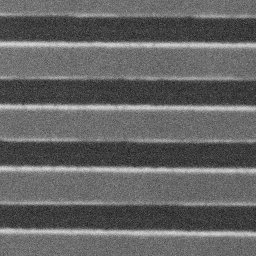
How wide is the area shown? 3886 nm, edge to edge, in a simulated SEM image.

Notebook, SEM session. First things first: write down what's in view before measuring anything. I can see lines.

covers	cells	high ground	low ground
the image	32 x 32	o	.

oooooooooooooooooooooooooooooooo
oooooooooooooooooooooooooooooooo
................................
................................
................................
................................
oooooooooooooooooooooooooooooooo
oooooooooooooooooooooooooooooooo
oooooooooooooooooooooooooooooooo
oooooooooooooooooooooooooooooooo
................................
................................
................................
oooooooooooooooooooo............
oooooooooooooooooooooooooooooooo
oooooooooooooooooooooooooooooooo
oooooooooooooooooooooooooooooooo
oooooooooooooooooooooooooooooooo
................................
................................
................................
oooooooooooooooooooooooooooooooo
oooooooooooooooooooooooooooooooo
oooooooooooooooooooooooooooooooo
oooooooooooooooooooooooooooooooo
.......................ooooooooo
................................
................................
................................
oooooooooooooooooooooooooooooooo
oooooooooooooooooooooooooooooooo
oooooooooooooooooooooooooooooooo